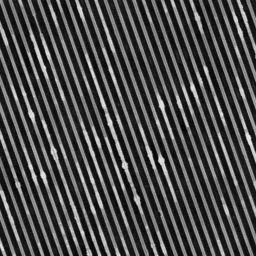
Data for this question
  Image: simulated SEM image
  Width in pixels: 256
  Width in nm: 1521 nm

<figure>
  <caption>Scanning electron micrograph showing parallel lines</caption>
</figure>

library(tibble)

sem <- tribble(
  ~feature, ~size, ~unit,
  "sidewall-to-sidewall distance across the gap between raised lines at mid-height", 40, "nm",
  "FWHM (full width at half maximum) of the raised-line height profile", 13.4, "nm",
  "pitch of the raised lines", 53.3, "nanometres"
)